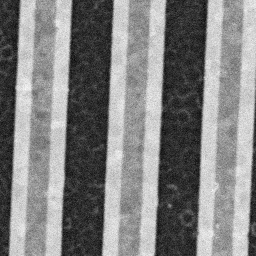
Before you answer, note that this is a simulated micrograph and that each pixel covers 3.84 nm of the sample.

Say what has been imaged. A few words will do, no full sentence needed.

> one or a few lines or trenches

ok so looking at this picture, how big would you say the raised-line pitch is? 360 nm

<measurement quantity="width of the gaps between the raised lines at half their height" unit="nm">213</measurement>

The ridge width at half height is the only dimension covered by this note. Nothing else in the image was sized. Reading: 0.145 micrometres